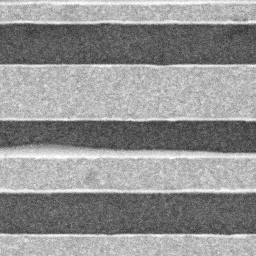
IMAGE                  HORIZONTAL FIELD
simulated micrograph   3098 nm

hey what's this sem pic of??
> lines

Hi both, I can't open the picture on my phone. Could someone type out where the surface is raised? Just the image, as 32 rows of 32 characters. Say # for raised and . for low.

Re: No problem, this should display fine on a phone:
################################
################################
################################
................................
................................
................................
................................
................................
################################
################################
################################
################################
################################
################################
################################
................................
................................
................................
................................
################.####.#.........
################################
################################
################################
################################
................................
................................
................................
................................
................................
################################
################################
################################